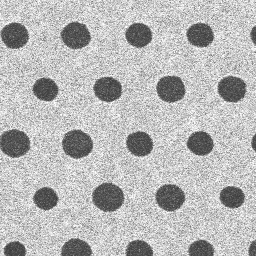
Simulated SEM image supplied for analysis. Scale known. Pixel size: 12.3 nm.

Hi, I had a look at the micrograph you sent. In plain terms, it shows a regular array of holes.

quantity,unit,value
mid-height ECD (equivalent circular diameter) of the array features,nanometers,329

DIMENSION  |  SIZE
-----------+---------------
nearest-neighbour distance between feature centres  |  755 nanometres